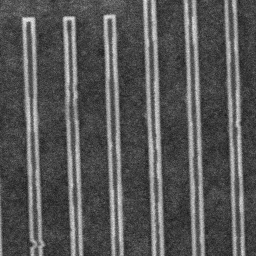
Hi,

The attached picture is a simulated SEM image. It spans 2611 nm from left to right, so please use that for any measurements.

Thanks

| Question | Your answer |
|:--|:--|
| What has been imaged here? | parallel lines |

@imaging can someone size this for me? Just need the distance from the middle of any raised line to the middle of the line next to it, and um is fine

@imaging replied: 0.413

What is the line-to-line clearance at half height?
320 nanometres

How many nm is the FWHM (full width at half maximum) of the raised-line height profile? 91.7